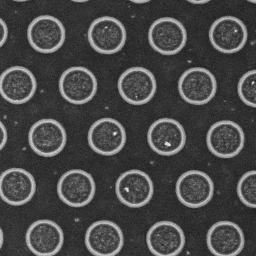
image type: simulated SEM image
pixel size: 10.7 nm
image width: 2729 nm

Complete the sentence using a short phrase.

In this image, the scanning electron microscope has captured a regular array of raised bodies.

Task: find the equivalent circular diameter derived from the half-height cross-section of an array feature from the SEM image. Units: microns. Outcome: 0.375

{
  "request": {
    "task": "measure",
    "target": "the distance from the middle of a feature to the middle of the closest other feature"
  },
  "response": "621 nanometres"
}